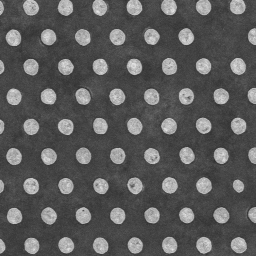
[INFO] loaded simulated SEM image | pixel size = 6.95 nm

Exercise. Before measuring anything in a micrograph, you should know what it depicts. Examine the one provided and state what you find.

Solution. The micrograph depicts a regular array of raised bodies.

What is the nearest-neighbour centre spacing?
235 nanometres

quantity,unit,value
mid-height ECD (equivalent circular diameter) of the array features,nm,107